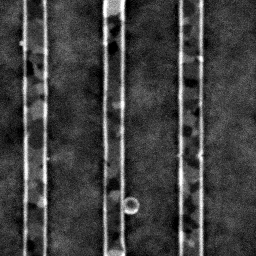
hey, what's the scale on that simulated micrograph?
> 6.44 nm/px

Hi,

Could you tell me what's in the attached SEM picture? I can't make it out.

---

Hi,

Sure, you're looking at one or a few lines or trenches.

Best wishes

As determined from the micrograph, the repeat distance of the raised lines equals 0.502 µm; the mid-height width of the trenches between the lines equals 380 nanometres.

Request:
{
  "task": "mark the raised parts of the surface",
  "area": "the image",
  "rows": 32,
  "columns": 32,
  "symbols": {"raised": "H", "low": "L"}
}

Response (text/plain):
LLLHHHLLLLLLLHHLLLLLLLLHHLLLLLLL
LLLHHHLLLLLLLHHLLLLLLLLHHLLLLLLL
LLLHHHLLLLLLLHHLLLLLLLLHHLLLLLLL
LLLHHHLLLLLLLHHLLLLLLLLHHLLLLLLL
LLLHHHLLLLLLLHHLLLLLLLLHHLLLLLLL
LLLHHHLLLLLLLHHLLLLLLLLHHLLLLLLL
LLLHHHLLLLLLLHHLLLLLLLLHHLLLLLLL
LLLHHHLLLLLLLHHLLLLLLLLHHLLLLLLL
LLLHHHLLLLLLLHHLLLLLLLLHHLLLLLLL
LLLHHHLLLLLLLHHLLLLLLLLHHLLLLLLL
LLLHHHLLLLLLLHHLLLLLLLLHHLLLLLLL
LLLHHHLLLLLLLHHLLLLLLLLHHLLLLLLL
LLLHHHLLLLLLLHHLLLLLLLLHHLLLLLLL
LLLHHHLLLLLLLHHLLLLLLLLHHLLLLLLL
LLLHHHLLLLLLLHHLLLLLLLLHHLLLLLLL
LLLHHHLLLLLLLHHLLLLLLLLHHLLLLLLL
LLLHHHLLLLLLLHHLLLLLLLLHHLLLLLLL
LLLHHHLLLLLLLHHLLLLLLLLHHLLLLLLL
LLLHHHLLLLLLLHHLLLLLLLLHHLLLLLLL
LLLHHHLLLLLLLHHLLLLLLLLHHLLLLLLL
LLLHHHLLLLLLLHHLLLLLLLLHHLLLLLLL
LLLHHHLLLLLLLHHLLLLLLLLHHLLLLLLL
LLLHHHLLLLLLLHHLLLLLLLLHHLLLLLLL
LLLHHHLLLLLLLHHLLLLLLLLHHLLLLLLL
LLLHHHLLLLLLLHHLLLLLLLLHHLLLLLLL
LLLHHHLLLLLLLHHLLLLLLLLHHLLLLLLL
LLLHHHLLLLLLLHHLLLLLLLLHHLLLLLLL
LLLHHHLLLLLLLHHLLLLLLLLHHLLLLLLL
LLLHHHLLLLLLLHHLLLLLLLLHHLLLLLLL
LLLHHHLLLLLLLHHLLLLLLLLHHLLLLLLL
LLLHHHLLLLLLLHHLLLLLLLLHHLLLLLLL
LLLHHHLLLLLLLHHLLLLLLLLHHLLLLLLL